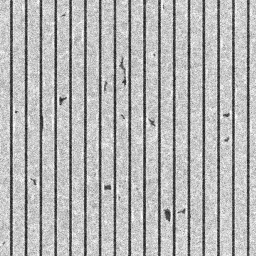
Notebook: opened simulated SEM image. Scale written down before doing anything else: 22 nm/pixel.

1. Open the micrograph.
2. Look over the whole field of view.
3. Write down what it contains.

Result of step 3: parallel lines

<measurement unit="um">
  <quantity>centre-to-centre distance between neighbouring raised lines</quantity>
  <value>0.325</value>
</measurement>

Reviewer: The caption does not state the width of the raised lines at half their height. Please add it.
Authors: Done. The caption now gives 242 nm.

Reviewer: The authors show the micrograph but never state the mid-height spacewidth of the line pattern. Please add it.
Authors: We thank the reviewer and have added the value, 3.87 pixels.